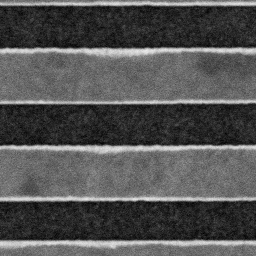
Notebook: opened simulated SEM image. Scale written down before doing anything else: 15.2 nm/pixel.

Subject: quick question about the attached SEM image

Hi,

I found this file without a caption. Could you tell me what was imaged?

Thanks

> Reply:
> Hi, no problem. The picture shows lines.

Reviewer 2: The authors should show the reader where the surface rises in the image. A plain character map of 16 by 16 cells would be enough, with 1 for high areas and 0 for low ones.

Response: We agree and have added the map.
0000000000000000
0000000000000000
0000000000000000
1111111111111111
1111111111111111
1111111111111111
0000000000000000
0000000000000000
0000000000000000
1111111111111111
1111111111111111
1111111111111111
1111111111111110
0000000000000000
0000000000000000
1111111111111111